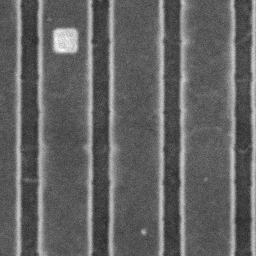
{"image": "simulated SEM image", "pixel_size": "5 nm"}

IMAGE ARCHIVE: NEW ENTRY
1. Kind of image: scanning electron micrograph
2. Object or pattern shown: wiring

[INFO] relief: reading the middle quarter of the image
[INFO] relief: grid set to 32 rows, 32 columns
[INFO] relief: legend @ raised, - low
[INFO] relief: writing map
@@@@@@@-----@@@@@@@@@@@@@-----@@
@@@@@@@-----@@@@@@@@@@@@@-----@@
@@@@@@@-----@@@@@@@@@@@@------@@
@@@@@@@-----@@@@@@@@@@@@------@@
@@@@@@@-----@@@@@@@@@@@@------@@
@@@@@@@-----@@@@@@@@@@@@------@@
@@@@@@@-----@@@@@@@@@@@@------@@
@@@@@@@-----@@@@@@@@@@@@------@@
@@@@@@@-----@@@@@@@@@@@@------@@
@@@@@@@-----@@@@@@@@@@@@------@@
@@@@@@------@@@@@@@@@@@@------@@
@@@@@@------@@@@@@@@@@@@------@@
@@@@@@------@@@@@@@@@@@@------@@
@@@@@@------@@@@@@@@@@@@------@@
@@@@@@------@@@@@@@@@@@@------@@
@@@@@@------@@@@@@@@@@@@------@@
@@@@@@------@@@@@@@@@@@@------@@
@@@@@@------@@@@@@@@@@@@------@@
@@@@@@------@@@@@@@@@@@@------@@
@@@@@@------@@@@@@@@@@@@------@@
@@@@@@------@@@@@@@@@@@@------@@
@@@@@@------@@@@@@@@@@@@------@@
@@@@@@@-----@@@@@@@@@@@@------@@
@@@@@@@-----@@@@@@@@@@@@------@@
@@@@@@@-----@@@@@@@@@@@@------@@
@@@@@@@-----@@@@@@@@@@@@------@@
@@@@@@@-----@@@@@@@@@@@@------@@
@@@@@@@-----@@@@@@@@@@@@------@@
@@@@@@@-----@@@@@@@@@@@@------@@
@@@@@@------@@@@@@@@@@@@------@@
@@@@@@------@@@@@@@@@@@@------@@
@@@@@@------@@@@@@@@@@@@------@@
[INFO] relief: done